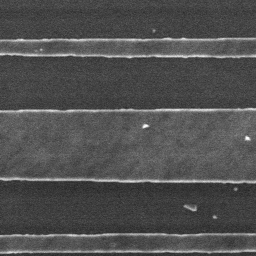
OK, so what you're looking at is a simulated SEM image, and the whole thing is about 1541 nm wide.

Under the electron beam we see lines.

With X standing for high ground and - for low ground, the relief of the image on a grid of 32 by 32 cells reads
--------------------------------
--------------------------------
--------------------------------
--------------------------------
--------------------------------
XXXXXXXXXXXXXXXXXXXXXXXXXXXXXXXX
XXXXXXXXXXXXXXXXXXXXXXXXXXXXXXXX
--------------------------------
--------------------------------
--------------------------------
--------------------------------
--------------------------------
--------------------------------
--------------------------------
XXXXXXXXXXXXXXXXXXXXXXXXXXXXXXXX
XXXXXXXXXXXXXXXXXXXXXXXXXXXXXXXX
XXXXXXXXXXXXXXXXXXXXXXXXXXXXXXXX
XXXXXXXXXXXXXXXXXXXXXXXXXXXXXXXX
XXXXXXXXXXXXXXXXXXXXXXXXXXXXXXXX
XXXXXXXXXXXXXXXXXXXXXXXXXXXXXXXX
XXXXXXXXXXXXXXXXXXXXXXXXXXXXXXXX
XXXXXXXXXXXXXXXXXXXXXXXXXXXXXXXX
---XXXXXXXXXXXXXXXXXXXXXXXXXXXXX
--------------------------------
--------------------------------
--------------------------------
--------------------------------
--------------------------------
--------------------------------
XXXXXXXXXXXXXXXXXXXXXXXXXXXXXXXX
XXXXXXXXXXXXXXXXXXXXXXXXXXXXXXXX
XXXXXXXXXXXXXXXXXXXXXXXXXXXXXX--